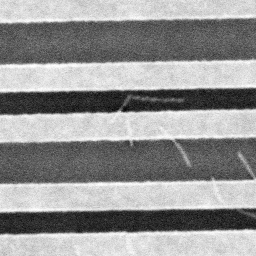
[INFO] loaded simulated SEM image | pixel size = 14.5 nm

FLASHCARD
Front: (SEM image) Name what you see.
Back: lines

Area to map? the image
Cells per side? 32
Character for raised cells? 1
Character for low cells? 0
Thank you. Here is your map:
11111111111111111111111111111111
11111111111111111111111111111111
11111111101000000000000000000000
00000000000000000000000000000000
00000000000000000000000000000000
00000000000000000000000000000000
00000000000000000000000000000000
00000000000000000000000000000000
11111111111111111111111111111111
11111111111111111111111111111111
11111111111111111111111111111111
00000000000000000000000000000000
00000000000000000000000000000000
00000000000000000000000000000000
11111111111111111111111111111111
11111111111111111111111111111111
11111111111111111111111111111111
11111111111111101100000000000000
00000000000000000000000000000000
00000000000000000000000000000000
00000000000000000000000000000000
00000000000000000000000000000000
00000000000000000000000000000001
11111111111111111111111111111111
11111111111111111111111111111111
11111111111111111111111111111111
00000000000000000000000000000000
00000000000000000000000000000000
00000000000000000000000000000000
11111111111111111111111111111111
11111111111111111111111111111111
11111111111111111111111111111111